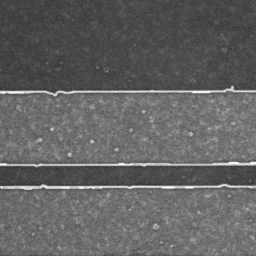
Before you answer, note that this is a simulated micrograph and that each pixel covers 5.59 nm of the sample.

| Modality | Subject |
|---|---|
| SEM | one or a few lines or trenches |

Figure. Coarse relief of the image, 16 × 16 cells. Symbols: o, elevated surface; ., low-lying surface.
................
................
................
................
................
................
oooooooooooooooo
oooooooooooooooo
oooooooooooooooo
oooooooooooooooo
................
................
oooooooooooooooo
oooooooooooooooo
oooooooooooooooo
oooooooooooooooo